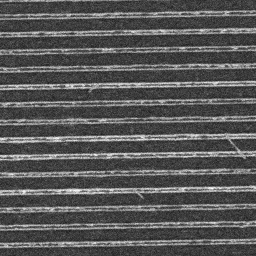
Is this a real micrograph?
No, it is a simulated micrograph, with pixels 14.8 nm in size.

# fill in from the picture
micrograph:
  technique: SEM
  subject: parallel lines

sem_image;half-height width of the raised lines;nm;66.4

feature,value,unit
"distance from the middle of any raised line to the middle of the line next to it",259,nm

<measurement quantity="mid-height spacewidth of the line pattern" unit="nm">188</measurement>